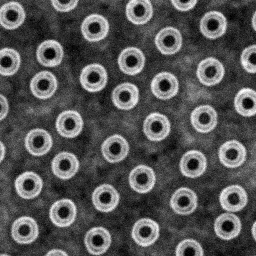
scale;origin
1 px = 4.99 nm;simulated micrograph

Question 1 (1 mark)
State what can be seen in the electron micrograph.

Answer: a regular array of ring-shaped raised bodies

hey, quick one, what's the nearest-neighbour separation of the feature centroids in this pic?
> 201 nm